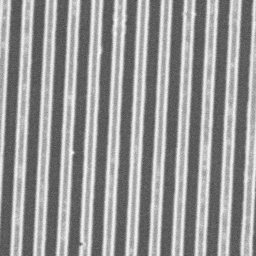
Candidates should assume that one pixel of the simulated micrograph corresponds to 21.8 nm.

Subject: parallel lines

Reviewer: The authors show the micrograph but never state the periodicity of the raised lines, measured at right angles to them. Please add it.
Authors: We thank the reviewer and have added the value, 502 nm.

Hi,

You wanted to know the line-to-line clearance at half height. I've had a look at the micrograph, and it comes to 0.294 µm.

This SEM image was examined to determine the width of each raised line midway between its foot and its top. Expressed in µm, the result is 0.21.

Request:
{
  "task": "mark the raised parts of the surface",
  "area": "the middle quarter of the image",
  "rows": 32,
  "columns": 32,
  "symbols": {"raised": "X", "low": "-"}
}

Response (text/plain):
-XX---XXX---XX----XX----XX----XX
-XX---XXX---XX----XX----XX----XX
-XX---XXX---XX----XX----XX---XXX
-XX---XXX---XX----XX----XX---XXX
XXX---XX----XX----XX----XX---XXX
XXX---XX----XX----XX----XX---XXX
XXX---XX----XX----XX----XX---XX-
XXX---XX----XX----XX---XXX---XX-
XX----XX----XX----XX---XXX---XX-
XX----XX----XX----XX---XXX---XX-
XX----XX----XX----XX---XXX---XX-
XX----XX----XX---XXX---XX----XX-
XX----XX----XX---XXX---XX----XX-
XX----XX----XX---XXX---XX----XX-
XX----XX----XX---XXX---XX----XX-
XX----XX---XXX---XX----XX----XX-
XX----XX---XXX---XX----XX----XX-
XX----XX---XXX---XX----XX----XX-
XX----XX---XXX---XX----XX----XX-
XX----XX---XX----XX----XX----XX-
XX---XXX---XX----XX----XX----XX-
XX---XXX---XX----XX----XX----XX-
XX---XXX---XX----XX----XX---XXX-
XX---XXX---XX----XX----XX---XXX-
XX---XX----XX----XX----XX---XXX-
XX---XX----XX----XX----XX---XXX-
XX---XX----XX----XX----XX---XX--
XX---XX----XX----XX---XXX---XX--
X----XX----XX----XX---XXX---XX--
X----XX----XX----XX---XXX---XX--
X----XX----XX----XX---XXX---XX--
X----XX----XX---XXX---XX----XX--